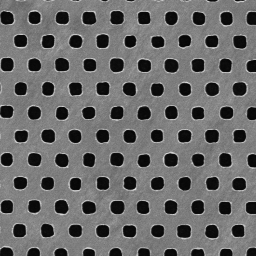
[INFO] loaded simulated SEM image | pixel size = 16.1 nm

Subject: a regular array of holes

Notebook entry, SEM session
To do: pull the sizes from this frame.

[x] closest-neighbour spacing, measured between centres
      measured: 429 nm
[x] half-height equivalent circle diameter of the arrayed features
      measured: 13.5 px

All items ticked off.